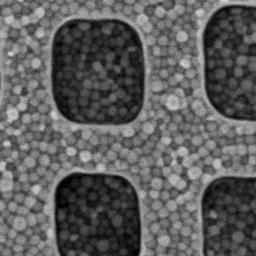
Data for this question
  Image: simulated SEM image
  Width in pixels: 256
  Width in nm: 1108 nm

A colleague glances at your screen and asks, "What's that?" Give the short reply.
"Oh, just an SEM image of holes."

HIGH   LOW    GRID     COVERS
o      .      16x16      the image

oooooooooooooo..
oooo....ooooo...
ooo......oooo...
ooo......oooo...
ooo......oooo...
ooo......oooo...
ooo......oooo...
oooo....ooooooo.
oooooooooooooooo
oooooooooooooooo
oooooooooooooooo
oooo....ooooo...
ooo......oooo...
ooo......oooo...
ooo......oooo...
oooo.....oooo...